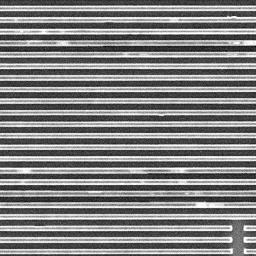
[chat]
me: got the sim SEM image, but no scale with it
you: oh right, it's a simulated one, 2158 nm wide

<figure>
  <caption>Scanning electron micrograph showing parallel lines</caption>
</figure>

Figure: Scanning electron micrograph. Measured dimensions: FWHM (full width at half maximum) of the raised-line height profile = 40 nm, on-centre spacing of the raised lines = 97.8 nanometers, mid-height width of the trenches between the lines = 56.9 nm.